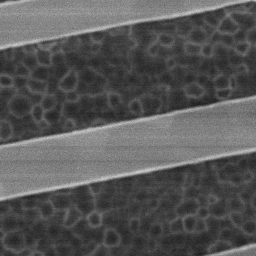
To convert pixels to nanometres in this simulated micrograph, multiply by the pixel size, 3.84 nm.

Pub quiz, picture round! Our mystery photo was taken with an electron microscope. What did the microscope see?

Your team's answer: one or a few lines or trenches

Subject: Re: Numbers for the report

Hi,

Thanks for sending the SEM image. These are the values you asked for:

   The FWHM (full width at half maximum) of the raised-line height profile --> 198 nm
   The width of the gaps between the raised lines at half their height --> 365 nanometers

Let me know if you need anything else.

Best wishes